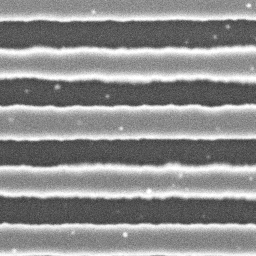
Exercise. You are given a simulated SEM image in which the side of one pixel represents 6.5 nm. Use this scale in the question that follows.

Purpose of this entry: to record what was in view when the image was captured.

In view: lines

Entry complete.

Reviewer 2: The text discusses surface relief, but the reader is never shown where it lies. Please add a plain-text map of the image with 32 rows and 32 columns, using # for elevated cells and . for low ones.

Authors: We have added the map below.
################################
################################
####..##############.....#......
................................
................................
................................
##.#############################
################################
################################
##..############################
................................
................................
................................
################################
################################
################################
################################
..###..#........................
................................
................................
................................
################################
################################
################################
.............##.#.#........#..##
................................
................................
................................
################################
################################
################################
################################